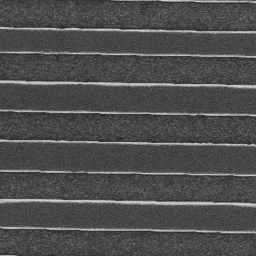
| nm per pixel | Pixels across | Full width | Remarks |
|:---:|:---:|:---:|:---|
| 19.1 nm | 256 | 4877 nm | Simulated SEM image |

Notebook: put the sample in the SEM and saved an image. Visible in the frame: lines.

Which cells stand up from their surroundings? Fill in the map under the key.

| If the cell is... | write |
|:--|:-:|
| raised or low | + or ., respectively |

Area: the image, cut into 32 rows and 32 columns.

................................
................................
................................
+...............................
++++++++++++++++++++++++++++++++
++++++++++++++++++++++++++++++++
..++++++++++++++++++++++++++++++
................................
................................
................................
++++++++++++++++................
++++++++++++++++++++++++++++++++
++++++++++++++++++++++++++++++++
++++++++++++++++++++++++++++++++
................................
................................
................................
................................
++++++++++++++++++++++++++++++++
++++++++++++++++++++++++++++++++
++++++++++++++++++++++++++++++++
..............++++++++++++++++++
................................
................................
................................
+++++++++++++++++++++++++++++...
++++++++++++++++++++++++++++++++
++++++++++++++++++++++++++++++++
++++++++++++++++++++++++++++++++
................................
................................
................................